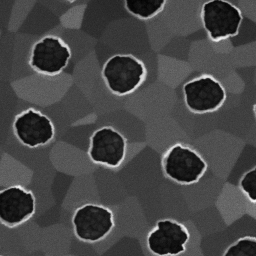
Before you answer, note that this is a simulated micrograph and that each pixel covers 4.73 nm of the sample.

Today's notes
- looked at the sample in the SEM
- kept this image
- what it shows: a regular array of holes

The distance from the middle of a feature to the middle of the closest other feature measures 354 nm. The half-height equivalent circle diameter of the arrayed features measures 0.167 micrometres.